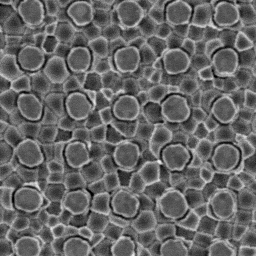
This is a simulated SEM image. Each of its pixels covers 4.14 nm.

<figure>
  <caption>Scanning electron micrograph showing a regular array of raised bodies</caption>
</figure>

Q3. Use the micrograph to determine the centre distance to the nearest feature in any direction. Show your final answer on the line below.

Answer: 185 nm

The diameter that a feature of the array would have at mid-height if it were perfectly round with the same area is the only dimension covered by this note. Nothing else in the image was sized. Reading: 105 nm